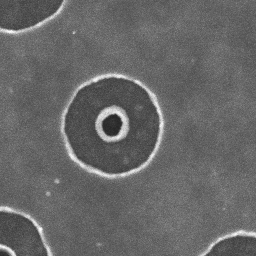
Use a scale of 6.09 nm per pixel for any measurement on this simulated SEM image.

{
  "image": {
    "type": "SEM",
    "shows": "ring-shaped grooves with a dot in the middle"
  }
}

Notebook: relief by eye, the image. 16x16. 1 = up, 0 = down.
0000111111111111
0011111111111111
1111111111111111
1111111111111111
1111111111111111
1111100001111111
1111000000111111
1111001000111111
1111000000111111
1111100000111111
1111110001111111
1111111111111111
1111111111111111
0111111111111111
0011111111111111
0001111111111000